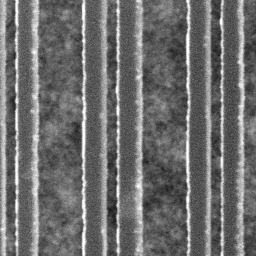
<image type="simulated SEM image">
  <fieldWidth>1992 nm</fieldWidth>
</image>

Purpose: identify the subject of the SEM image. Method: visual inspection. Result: lines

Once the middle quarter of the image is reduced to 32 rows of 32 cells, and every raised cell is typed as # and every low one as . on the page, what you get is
.....#####....#####............#
.....#####....#####............#
.....#####....#####............#
.....#####....#####............#
.....#####....#####............#
.....#####...######............#
.....#####...######............#
.....#####...######............#
.....#####....#####............#
.....#####....#####............#
.....#####....#####............#
.....#####....#####............#
.....#####....#####............#
.....#####....#####............#
.....#####....#####............#
.....#####....#####............#
.....#####....#####............#
.....#####....#####............#
.....#####....#####............#
.....#####....#####............#
.....#####....#####............#
.....#####....#####............#
.....#####....#####............#
.....#####....#####............#
.....#####....#####............#
.....#####....#####............#
.....#####....#####............#
.....#####....#####............#
.....#####....#####............#
.....#####....#####............#
.....#####....#####............#
.....#####....#####............#